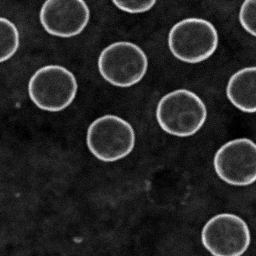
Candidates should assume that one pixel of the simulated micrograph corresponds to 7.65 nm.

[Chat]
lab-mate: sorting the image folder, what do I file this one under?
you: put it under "raised bodies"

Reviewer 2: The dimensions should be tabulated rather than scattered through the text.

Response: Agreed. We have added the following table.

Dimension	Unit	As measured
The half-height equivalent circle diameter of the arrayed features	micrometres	0.343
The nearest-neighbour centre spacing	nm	567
